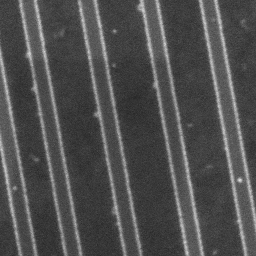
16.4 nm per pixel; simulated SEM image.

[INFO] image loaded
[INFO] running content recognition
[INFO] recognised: lines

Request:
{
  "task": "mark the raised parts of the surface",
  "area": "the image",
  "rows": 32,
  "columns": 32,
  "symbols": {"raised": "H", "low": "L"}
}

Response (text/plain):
LLLHHLLLLLHHLLLLLLHHLLLLLHHLLLLL
LLLHHLLLLLHHLLLLLLHHLLLLLHHLLLLL
LLLHHLLLLLHHLLLLLLHHLLLLLHHHLLLL
LLLHHLLLLLHHHLLLLLHHLLLLLLHHLLLL
LLLHHLLLLLLHHLLLLLHHHLLLLLHHLLLL
LLLHHLLLLLLHHLLLLLLHHLLLLLHHLLLL
LLLLHHLLLLLHHLLLLLLHHLLLLLHHLLLL
LLLLHHLLLLLHHLLLLLLHHLLLLLHHLLLL
LLLLHHLLLLLHHLLLLLLHHLLLLLHHHLLL
HLLLHHLLLLLHHHLLLLLHHLLLLLLHHLLL
HLLLHHLLLLLLHHLLLLLHHHLLLLLHHLLL
HLLLLHHLLLLLHHLLLLLLHHLLLLLHHLLL
HLLLLHHLLLLLHHLLLLLLHHLLLLLHHLLL
HLLLLHHLLLLLHHLLLLLLHHLLLLLHHHLL
HLLLLHHLLLLLHHHLLLLLHHLLLLLLHHLL
HHLLLHHLLLLLLHHLLLLLHHHLLLLLHHLL
HHLLLHHLLLLLLHHLLLLLLHHLLLLLHHLL
HHLLLHHHLLLLLHHLLLLLLHHLLLLLHHLL
HHLLLLHHLLLLLHHLLLLLLHHLLLLLHHLL
HHLLLLHHLLLLLHHLLLLLLHHLLLLLHHLL
HHHLLLHHLLLLLHHHLLLLLHHLLLLLLHHL
LHHLLLHHLLLLLLHHLLLLLHHHLLLLLHHL
LHHLLLHHHLLLLLHHLLLLLLHHLLLLLHHL
LHHLLLLHHLLLLLHHLLLLLLHHLLLLLHHL
LHHLLLLHHLLLLLHHLLLLLLHHLLLLLHHL
LHHLLLLHHLLLLLHHHLLLLLHHLLLLLLHH
LHHHLLLHHLLLLLLHHLLLLLHHLLLLLLHH
LLHHLLLHHLLLLLLHHLLLLLLHHLLLLLHH
LLHHLLLHHHLLLLLHHLLLLLLHHLLLLLHH
LLHHLLLLHHLLLLLHHLLLLLLHHLLLLLHH
LLHHLLLLHHLLLLLHHLLLLLLHHLLLLLHH
LLHHHLLLHHLLLLLHHHLLLLLHHLLLLLLH